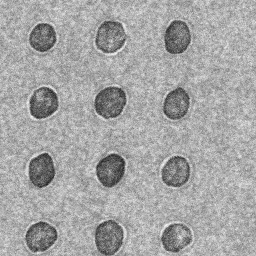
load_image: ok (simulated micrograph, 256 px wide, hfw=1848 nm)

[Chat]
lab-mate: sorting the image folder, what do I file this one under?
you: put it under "a regular array of holes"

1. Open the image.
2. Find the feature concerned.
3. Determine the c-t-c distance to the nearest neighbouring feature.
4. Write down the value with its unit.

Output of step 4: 473 nm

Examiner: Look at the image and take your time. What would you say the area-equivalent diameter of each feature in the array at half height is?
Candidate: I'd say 226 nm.